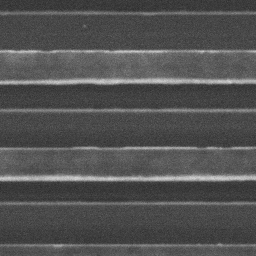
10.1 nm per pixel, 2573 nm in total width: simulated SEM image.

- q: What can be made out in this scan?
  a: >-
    lines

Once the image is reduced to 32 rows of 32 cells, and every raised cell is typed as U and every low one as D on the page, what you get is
DDDDDDDDDDDDDDDDDDDDDDDDDDDDDDDD
DDDDDDDDDDDDDDDDDDDDDDDDDDDDDDDD
DDDDDDDDDDDDDDDDDDDDDDDDDDDDDDDD
DDDDDDDDDDDDDDDDDDDDDDDDDDDDDDDD
DDDDDDDDDDDDDDDDDDDDDDDDDDDDDDDD
DDDDDDDDDDDDDDDDDDDDDDDDDDDDDDDD
UUUUUUUUUUUUUUUUUUUUUUUUUUUUUUUU
UUUUUUUUUUUUUUUUUUUUUUUUUUUUUUUU
UUUUUUUUUUUUUUUUUUUUUUUUUUUUUUUU
UUUUUUUUUUUUUUUUUUUUUUUUUUUUUUUU
DDDDDDDDDDDDDDDDDDDDDDDDDDDDDDDD
DDDDDDDDDDDDDDDDDDDDDDDDDDDDDDDD
DDDDDDDDDDDDDDDDDDDDDDDDDDDDDDDD
DDDDDDDDDDDDDDDDDDDDDDDDDDDDDDDD
DDDDDDDDDDDDDDDDDDDDDDDDDDDDDDDD
DDDDDDDDDDDDDDDDDDDDDDDDDDDDDDDD
DDDDDDDDDDDDDDDDDDDDDDDDDDDDDDDD
DDDDDDDDDDDDDDDDDDDDDDDDDDDDDDDD
DDDDDDDDDUUUUDDUUUUUUUUUUUUUDUUU
UUUUUUUUUUUUUUUUUUUUUUUUUUUUUUUU
UUUUUUUUUUUUUUUUUUUUUUUUUUUUUUUU
UUUUUUUUUUUUUUUUUUUUUUUUUUUUUUUU
UDDDDDDDDDDUUDDDDDUUDDDDDDDDDDDD
DDDDDDDDDDDDDDDDDDDDDDDDDDDDDDDD
DDDDDDDDDDDDDDDDDDDDDDDDDDDDDDDD
DDDDDDDDDDDDDDDDDDDDDDDDDDDDDDDD
DDDDDDDDDDDDDDDDDDDDDDDDDDDDDDDD
DDDDDDDDDDDDDDDDDDDDDDDDDDDDDDDD
DDDDDDDDDDDDDDDDDDDDDDDDDDDDDDDD
DDDDDDDDDDDDDDDDDDDDDDDDDDDDDDDD
DDDDDDDDDDDDDDDDDDDDDDDDDDDDDDDD
UUUUUUUUUUUUUUUUUUUUUUUUUUUUUUUU